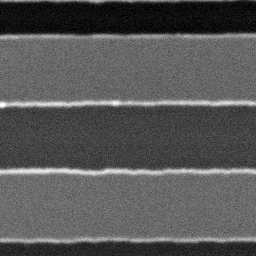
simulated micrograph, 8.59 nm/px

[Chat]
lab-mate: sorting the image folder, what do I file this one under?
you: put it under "lines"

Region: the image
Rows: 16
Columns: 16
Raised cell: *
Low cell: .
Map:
................
................
****************
****************
****************
****************
*......*........
................
................
................
................
****************
****************
****************
****************
................